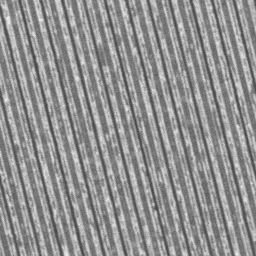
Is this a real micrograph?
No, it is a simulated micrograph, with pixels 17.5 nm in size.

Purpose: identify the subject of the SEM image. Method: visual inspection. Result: parallel lines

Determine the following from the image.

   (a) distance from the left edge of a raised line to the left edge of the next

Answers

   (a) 182 nm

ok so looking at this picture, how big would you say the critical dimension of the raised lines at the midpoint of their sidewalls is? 0.0913 um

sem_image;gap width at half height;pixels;4.49